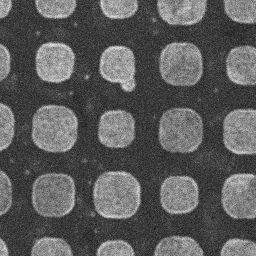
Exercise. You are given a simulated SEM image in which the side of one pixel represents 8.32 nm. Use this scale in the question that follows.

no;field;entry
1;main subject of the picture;a regular array of raised bodies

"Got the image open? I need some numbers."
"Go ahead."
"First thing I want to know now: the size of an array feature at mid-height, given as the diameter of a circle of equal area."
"360 nm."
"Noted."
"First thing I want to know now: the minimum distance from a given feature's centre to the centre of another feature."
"522 nanometres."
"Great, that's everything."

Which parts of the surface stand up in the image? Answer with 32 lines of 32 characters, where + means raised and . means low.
+....++++....++++...++++++..++++
+....++++....++++...++++++..++++
.....................++++....+++
................................
................................
.......................+........
+....++++....+++....+++++....+++
+....++++....++++...+++++....+++
+....++++....++++...+++++....+++
+....++++....+++....+++++....+++
...............++....+++......++
................................
................................
+....+++........................
++..+++++....+++....+++++....+++
++..++++++...++++...+++++...++++
++..++++++..+++++...+++++...++++
+...+++++....++++...+++++...++++
.....++++............+++.....+++
................................
................................
................................
+....++++...+++++....+++.....+++
+...+++++...+++++...+++++...++++
+...+++++...+++++...+++++...++++
+...+++++...+++++...++++....++++
+....+++....+++++....++.....++++
................................
................................
................................
+....+++.....+++....+++++...++++
+...+++++...+++++...+++++...++++